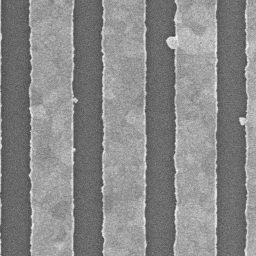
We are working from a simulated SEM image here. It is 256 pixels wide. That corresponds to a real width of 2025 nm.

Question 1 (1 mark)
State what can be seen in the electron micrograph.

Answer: lines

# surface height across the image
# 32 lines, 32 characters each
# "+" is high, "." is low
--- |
....+++++....+++++....+++++....+
....+++++....+++++....+++++....+
....+++++....+++++....+++++....+
....+++++....+++++....+++++....+
....+++++....+++++....+++++....+
....+++++....+++++...++++++....+
....+++++....+++++....+++++....+
....+++++....+++++....+++++....+
....+++++....+++++....+++++....+
....+++++....+++++....+++++....+
....+++++....+++++....+++++....+
....+++++....+++++....+++++....+
....+++++....+++++....+++++....+
....+++++....+++++....+++++....+
....+++++....+++++....+++++....+
....+++++....+++++....+++++....+
....+++++....+++++....+++++....+
....+++++....+++++....+++++....+
....+++++....+++++....+++++....+
....+++++....+++++....+++++....+
....+++++....+++++....+++++....+
....+++++....+++++....+++++....+
....+++++....+++++....+++++....+
....+++++....+++++....+++++....+
....+++++....+++++....+++++....+
....+++++....+++++....+++++....+
....+++++....+++++....+++++....+
....+++++....+++++....+++++....+
....+++++....+++++....+++++....+
....+++++....+++++....+++++....+
....+++++....+++++....+++++....+
....+++++....+++++....+++++....+